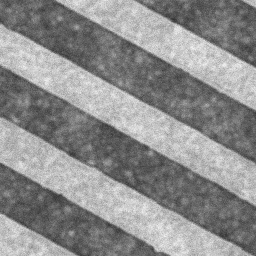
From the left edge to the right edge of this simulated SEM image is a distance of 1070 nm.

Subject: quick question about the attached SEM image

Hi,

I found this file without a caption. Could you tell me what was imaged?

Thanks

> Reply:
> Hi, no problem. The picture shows one or a few lines or trenches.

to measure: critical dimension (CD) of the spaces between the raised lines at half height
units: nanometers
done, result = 198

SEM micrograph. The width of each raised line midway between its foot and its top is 149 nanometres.